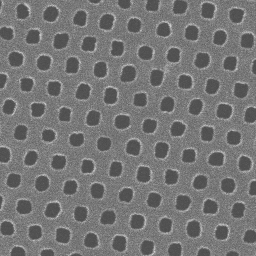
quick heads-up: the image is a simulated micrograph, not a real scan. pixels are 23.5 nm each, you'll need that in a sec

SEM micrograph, a regular array of holes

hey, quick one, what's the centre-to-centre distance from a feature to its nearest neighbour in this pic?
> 643 nanometres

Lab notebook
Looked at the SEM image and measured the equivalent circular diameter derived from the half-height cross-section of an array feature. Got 14.9 pixels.